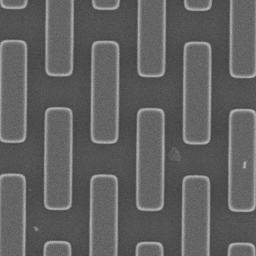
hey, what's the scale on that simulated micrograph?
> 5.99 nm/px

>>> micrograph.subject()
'groups of lines, slits or small figures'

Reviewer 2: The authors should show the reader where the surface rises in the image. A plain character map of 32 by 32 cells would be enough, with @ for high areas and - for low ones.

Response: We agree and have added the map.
@@@---@@@---@@@--@@@@--@@@---@@@
------@@@--------@@@@--------@@@
------@@@--------@@@@--------@@@
------@@@--------@@@@--------@@@
------@@@--------@@@@--------@@@
@@@---@@@---@@@--@@@@--@@@---@@@
@@@---@@@--@@@@--@@@---@@@---@@@
@@@---@@@--@@@@--@@@---@@@---@@@
@@@---@@@--@@@@--@@@---@@@---@@@
@@@--------@@@@---@@---@@@---@@@
@@@--------@@@@--------@@@------
@@@--------@@@@--------@@@------
@@@--------@@@@--------@@@------
@@@--------@@@@--------@@@------
@@@---@@@--@@@@--@@@---@@@---@@@
@@@---@@@--@@@@--@@@---@@@---@@@
@@@---@@@--@@@@--@@@---@@@---@@@
@@@---@@@---@@@--@@@---@@@---@@@
------@@@--------@@@---------@@@
------@@@--------@@@---------@@@
------@@@--------@@@---------@@@
------@@@--------@@@---------@@@
@@@---@@@--@@@@--@@@---@@@---@@@
@@@---@@@--@@@@--@@@---@@@---@@@
@@@---@@@--@@@@--@@@---@@@---@@@
@@@---@@@--@@@@--@@@---@@@---@@@
@@@--------@@@@--------@@@------
@@@--------@@@@--------@@@------
@@@--------@@@@--------@@@------
@@@--------@@@@--------@@@------
@@@---@@@--@@@@---@@---@@@---@@-
@@@---@@@--@@@@--@@@---@@@---@@@